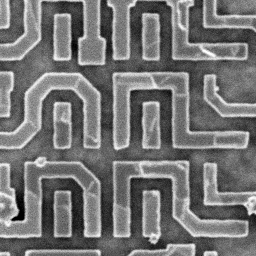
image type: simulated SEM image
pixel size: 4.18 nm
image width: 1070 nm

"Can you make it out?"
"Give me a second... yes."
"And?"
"wiring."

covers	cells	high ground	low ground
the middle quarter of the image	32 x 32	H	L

LLLLLLLLLLLLLLLLLLLLLLLLLLLLLLLL
LLLLLLLLLLLLLLLLLLLLLLLLLLLLLLLL
HLLLLLLLLLLLLHHHHHHHHHHHHHHHHHHL
HHHHHLLLLLLLHHHHHHHHHHHHHHHHHHHL
HHHHHHLLLLLLHHHHHHHHHHHHHHHHHHHL
HHHHHHHLLLLLHHHHHHHHHHHHHHHHHHHL
LLLHHHHHLLLLHHHHHLLLLLLLLLLHHHHL
LLLLHHHHHLLLHHHHLLLLLLLLLLLHHHHL
LLLLHHHHHLLLLHHHLLLLLLLLLLLHHHHL
LLLLLHHHHLLLLHHHLLLLLLLLLLLHHHHL
HHLLLHHHHLLLHHHHLLLLHHHHLLLHHHHL
HHLLLHHHHLLLHHHHLLLLHHHHLLLHHHHL
HHLLLHHHHLLLHHHHLLLLHHHHLLLHHHHL
HHLLLHHHHLLLHHHHLLLLHHHHLLLHHHHL
HHLLLHHHHLLLHHHHLLLLHHHHLLLHHHHL
HHLLLHHHHLLLHHHHLLLLHHHHLLLHHHHL
HHLLLHHHHLLLHHHHLLLLHHHHLLLHHHHL
HHLLLHHHHLLLHHHHLLLLHHHHLLLHHHHH
HHLLLHHHHLLLHHHHLLLLHHHHLLLHHHHH
HHLLLHHHHLLLLHHHLLLLHHHHLLLHHHHH
HHLLLHHHHLLLLHHHLLLLHHHHLLLHHHHH
LLLLLLLLLLLLLLLLLLLLLLLLLLLLLLLL
LLLLLLLLLLLLLLLLLLLLLLLLLLLLLLLL
LLLLLLLLLLLLLLLLLLLLLLLLLLLLLLLL
LLLLLLLLLLLLLHHHHLHHHHHHHHHHHHHL
HHHHHLLLLLLLHHHHHHHHHHHHHHHHHHHL
HHHHHHLLLLLLHHHHHHHHHHHHHHHHHHHL
HHHHHHHLLLLLHHHHHHHHHHHHHHHHHHHL
LLHHHHHHLLLLHHHHHLLLLLLLLLLHHHHL
LLLHHHHHHLLLHHHHLLLLLLLLLLLHHHHL
LLLLHHHHHLLLLHHHLLLLLLLLLLLHHHHL
LLLLLHHHHLLLLHHHLLLLLLLLLLLHHHHL